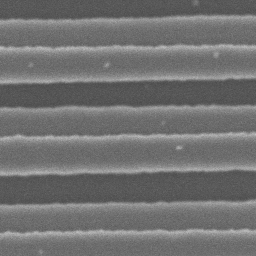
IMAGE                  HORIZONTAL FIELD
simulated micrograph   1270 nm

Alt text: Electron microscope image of lines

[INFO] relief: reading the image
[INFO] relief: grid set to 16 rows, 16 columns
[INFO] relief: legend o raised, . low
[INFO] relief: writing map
................
oooooooooooooooo
oooooooooooooooo
oooooooooooooooo
oooooooooooooooo
................
................
oooooooooooooooo
oooooooooooooooo
oooooooooooooooo
oooooooooooooooo
................
................
oooooooooooooooo
oooooooooooooooo
oooooooooooooooo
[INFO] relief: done